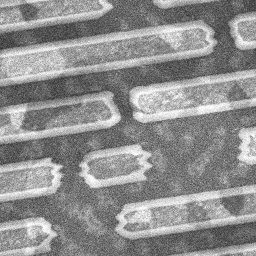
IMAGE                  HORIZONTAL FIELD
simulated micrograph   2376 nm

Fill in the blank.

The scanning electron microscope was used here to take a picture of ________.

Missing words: parallel lines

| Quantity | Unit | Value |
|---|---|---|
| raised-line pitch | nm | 526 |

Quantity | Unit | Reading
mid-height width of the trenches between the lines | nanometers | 252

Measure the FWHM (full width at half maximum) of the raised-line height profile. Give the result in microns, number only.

0.278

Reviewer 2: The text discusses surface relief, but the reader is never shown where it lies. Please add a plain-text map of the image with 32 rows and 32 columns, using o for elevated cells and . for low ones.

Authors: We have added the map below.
ooooooooooooo.......oo..........
ooooooooooooo...................
oooooooo.....................ooo
oo...................ooooo...ooo
..............oooooooooooo...ooo
........ooooooooooooooooooo...oo
.ooooooooooooooooooooooooo......
ooooooooooooooooooo.............
ooooooooooooo...................
oooooo.......................ooo
......................oooooooooo
.................ooooooooooooooo
.........ooooo...ooooooooooooooo
..oooooooooooo...ooooooooooo....
ooooooooooooooo..oooo...........
oooooooooooooo..................
oooooooo.......................o
o..............................o
...............................o
...........ooooooo............oo
...ooo....oooooooo..............
ooooooo....ooooooo..............
ooooooo....ooooo................
ooooooo.........................
oo.......................ooooooo
..................oooooooooooooo
...............ooooooooooooooooo
...............ooooooooooooooo..
oooooo.........ooooooooo........
ooooooo.........o...............
oooooo..........................
oooo.......................ooooo